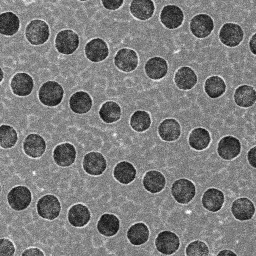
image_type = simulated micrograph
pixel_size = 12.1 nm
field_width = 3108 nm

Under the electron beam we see a regular array of holes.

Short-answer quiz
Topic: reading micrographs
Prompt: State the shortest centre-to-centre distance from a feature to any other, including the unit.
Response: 374 nm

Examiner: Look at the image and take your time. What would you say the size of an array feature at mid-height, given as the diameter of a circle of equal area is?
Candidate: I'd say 288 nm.